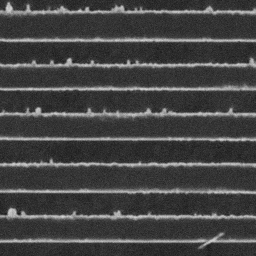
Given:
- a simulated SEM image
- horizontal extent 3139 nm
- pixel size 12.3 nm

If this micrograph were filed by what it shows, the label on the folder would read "lines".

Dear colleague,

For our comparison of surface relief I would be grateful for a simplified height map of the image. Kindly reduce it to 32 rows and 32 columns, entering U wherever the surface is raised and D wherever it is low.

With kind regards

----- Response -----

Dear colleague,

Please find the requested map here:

DDDDDDDDDDDDDDDDDDDDDDDDDDDDDDDD
UUUUDUUUUUUUUUUUUUUUUUUUUUUUUUUU
UUUUUUUUUUUUUUUUUUUUUUUUUUUUUUUU
UUUUUUUUUUUUUUUUUUUUUUUUUUUUUUUU
UUUUUUUUUUUUUUUUUUUUUUUUUUUUUUUU
DDDDDDDDDDDDDDDDDDDDDDDDDDDDDDDD
DDDDDDDDDDDDDDDDDDDDDDDDDDDDDDDD
DDDDDDDDDDDDDDDDDDDDDDDDDDDDDDDD
UUUUUUUUUUUUUUUUUUUUUUUUUUUUUUUU
UUUUUUUUUUUUUUUUUUUUUUUUUUUUUUUU
UUUUUUUUUUUUUUUUUUUUUUUUUUUUUUUU
DDDDDDDDDDDDDDDDDDDDDDDDDDDDDDDD
DDDDDDDDDDDDDDDDDDDDDDDDDDDDDDDD
DDDDDDDDDDDDDDDDDDDDDDDDDDDDDDDD
UUUUUUUUUUUUUUUUUUUUUUUUUUUUUUUU
UUUUUUUUUUUUUUUUUUUUUUUUUUUUUUUU
UUUUUUUUUUUUUUUUUUUUUUUUUUUUUUUU
DDDDDDDDDDDDDDDDDDDDDDDDDDDDDUDD
DDDDDDDDDDDDDDDDDDDDDDDDDDDDDDDD
DDDDDDDDDDDDDDDDDDDDDDDDDDDDDDDD
DDDDDDUDDUUUUDUDDDDDDUUDUDDDDUDD
UUUUUUUUUUUUUUUUUUUUUUUUUUUUUUUU
UUUUUUUUUUUUUUUUUUUUUUUUUUUUUUUU
UUUUUUUUUUUUUUUUUUUUUUUUUUUUUUUU
DDDDDDDDDDDDDDDDDDDDDDDDDDDDDDDD
DDDDDDDDDDDDDDDDDDDDDDDDDDDDDDDD
DUDDDDDDDDDDDDDDDDDDDDDDDDDDDDDD
UUUUUUUUUUUUUUUUUUUUUUUUUUUUUUUU
UUUUUUUUUUUUUUUUUUUUUUUUUUUUUUUU
UUUUUUUUUUUUUUUUUUUUUUUUUUUUUUUU
DDDDDDDDDDDDDDDDDDDDDDDDDDDDDDDD
DDDDDDDDDDDDDDDDDDDDDDDDDDDDDDDD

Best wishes